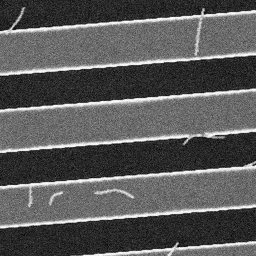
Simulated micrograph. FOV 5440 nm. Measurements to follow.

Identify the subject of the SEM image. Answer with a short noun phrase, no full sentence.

lines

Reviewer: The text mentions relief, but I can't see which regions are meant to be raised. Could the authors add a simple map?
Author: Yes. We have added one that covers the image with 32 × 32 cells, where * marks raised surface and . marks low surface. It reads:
................................
..............................**
..................**************
......**************************
********************************
********************************
********************************
************************........
************....................
................................
................................
............................****
...............*****************
....****************************
********************************
********************************
*******************************.
******************..............
*******.........................
................................
................................
.......................*********
..........**********************
********************************
********************************
********************************
************************........
*************...................
................................
................................
............................****
................****************